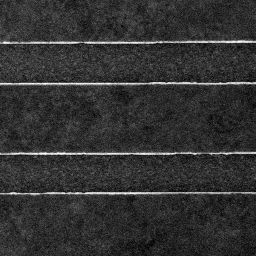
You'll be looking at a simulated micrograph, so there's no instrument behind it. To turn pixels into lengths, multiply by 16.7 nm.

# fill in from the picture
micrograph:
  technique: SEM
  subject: lines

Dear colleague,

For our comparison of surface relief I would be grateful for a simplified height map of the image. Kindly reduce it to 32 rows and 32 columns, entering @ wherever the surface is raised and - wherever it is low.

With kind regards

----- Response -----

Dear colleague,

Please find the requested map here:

@@@@@@@@@@@@@@@@@@@@@@@@@@@@@@@@
@@@@@@@@@@@@@@@@@@@@@@@@@@@@@@@@
@@@@@@@@@@@@@@@@@@@@@@@@@@@@@@@@
@@@@@@@@@@@@@@@@@@@@@@@@@@@@@@@@
@@@@@@@@@@@@@@@@@@@@@@@@@@@@@@@@
--------------------------------
--------------------------------
--------------------------------
--------------------------------
--------------------------------
@@@@@@@@@@@@@@@@@@@@@@@@@@@@@@@@
@@@@@@@@@@@@@@@@@@@@@@@@@@@@@@@@
@@@@@@@@@@@@@@@@@@@@@@@@@@@@@@@@
@@@@@@@@@@@@@@@@@@@@@@@@@@@@@@@@
@@@@@@@@@@@@@@@@@@@@@@@@@@@@@@@@
@@@@@@@@@@@@@@@@@@@@@@@@@@@@@@@@
@@@@@@@@@@@@@@@@@@@@@@@@@@@@@@@@
@@@@@@@@@@@@@@@@@@@@@@@@@@@@@@@@
@@@@@@@@@@@@@@@@@@@@@@@@@@@@@@@@
--------------------------------
--------------------------------
--------------------------------
--------------------------------
--------------------------------
@@@@@@@@@@@@@@@@@@@@@@@@@@@@@@@@
@@@@@@@@@@@@@@@@@@@@@@@@@@@@@@@@
@@@@@@@@@@@@@@@@@@@@@@@@@@@@@@@@
@@@@@@@@@@@@@@@@@@@@@@@@@@@@@@@@
@@@@@@@@@@@@@@@@@@@@@@@@@@@@@@@@
@@@@@@@@@@@@@@@@@@@@@@@@@@@@@@@@
@@@@@@@@@@@@@@@@@@@@@@@@@@@@@@@@
@@@@@@@@@@@@@@@@@@@@@@@@@@@@@@@@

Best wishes